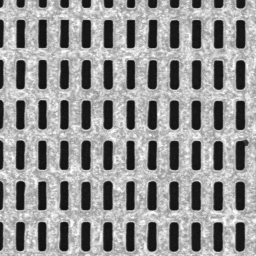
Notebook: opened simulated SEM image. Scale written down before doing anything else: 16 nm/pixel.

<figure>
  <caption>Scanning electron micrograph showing a regular array of holes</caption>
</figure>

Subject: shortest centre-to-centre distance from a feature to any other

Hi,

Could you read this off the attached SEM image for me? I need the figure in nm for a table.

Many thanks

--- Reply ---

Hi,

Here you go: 351